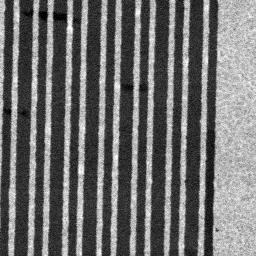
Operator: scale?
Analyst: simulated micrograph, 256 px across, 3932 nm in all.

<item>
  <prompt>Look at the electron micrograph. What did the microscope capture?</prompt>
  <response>parallel lines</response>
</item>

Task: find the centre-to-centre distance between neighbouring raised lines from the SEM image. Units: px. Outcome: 17.3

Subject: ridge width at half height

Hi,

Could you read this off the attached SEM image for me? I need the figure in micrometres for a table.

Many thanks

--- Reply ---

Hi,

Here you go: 0.073